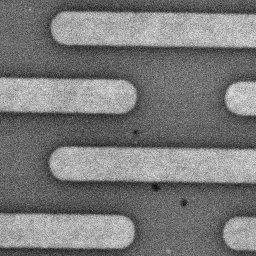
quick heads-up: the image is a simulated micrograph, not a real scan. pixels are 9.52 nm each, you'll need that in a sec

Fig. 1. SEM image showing groups of lines, slits or small figures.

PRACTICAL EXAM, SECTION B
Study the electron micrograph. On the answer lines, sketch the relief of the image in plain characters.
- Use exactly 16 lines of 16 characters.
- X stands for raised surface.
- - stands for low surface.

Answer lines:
----------------
---XXXXXXXXXXXXX
----XXXXXXXXXXXX
----------------
----------------
XXXXXXXX------XX
XXXXXXXX------XX
----------------
----------------
---XXXXXXXXXXXXX
---XXXXXXXXXXXXX
----------------
----------------
XXXXXXXX--------
XXXXXXXX------XX
---------------X